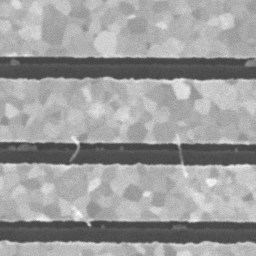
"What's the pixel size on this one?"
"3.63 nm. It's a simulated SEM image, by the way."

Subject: lines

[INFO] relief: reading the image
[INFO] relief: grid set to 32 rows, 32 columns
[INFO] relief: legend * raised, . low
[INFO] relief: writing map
********************************
********************************
********************************
********************************
********************************
********************************
********************************
................................
................................
................................
********************************
********************************
********************************
********************************
********************************
********************************
********************************
********************************
................................
................................
..*.*...........................
********************************
********************************
********************************
********************************
********************************
********************************
****.*******.*******************
................................
................................
**********************.*****.***
********************************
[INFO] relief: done